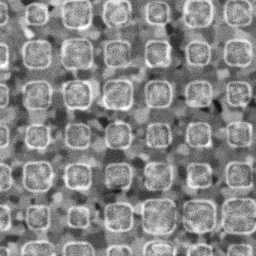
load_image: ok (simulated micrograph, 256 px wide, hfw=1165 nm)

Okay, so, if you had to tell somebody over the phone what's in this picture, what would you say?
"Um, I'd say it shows a regular array of holes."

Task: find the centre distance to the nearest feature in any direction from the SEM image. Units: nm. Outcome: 182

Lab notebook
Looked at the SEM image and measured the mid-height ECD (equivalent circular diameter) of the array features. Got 118 nanometres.